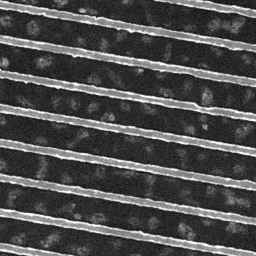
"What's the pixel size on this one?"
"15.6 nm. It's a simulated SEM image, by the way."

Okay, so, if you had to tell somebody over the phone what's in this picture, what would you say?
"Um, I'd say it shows parallel lines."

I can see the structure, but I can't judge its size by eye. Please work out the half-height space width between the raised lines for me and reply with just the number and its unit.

422 nm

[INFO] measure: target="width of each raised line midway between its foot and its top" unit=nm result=104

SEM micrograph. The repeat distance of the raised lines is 531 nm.